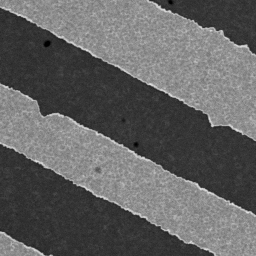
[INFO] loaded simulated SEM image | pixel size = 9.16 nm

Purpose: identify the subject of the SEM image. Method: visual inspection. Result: one or a few lines or trenches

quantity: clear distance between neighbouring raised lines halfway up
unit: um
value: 0.619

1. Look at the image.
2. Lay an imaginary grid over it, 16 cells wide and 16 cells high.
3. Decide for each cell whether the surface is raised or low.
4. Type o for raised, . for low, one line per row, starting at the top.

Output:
oooooooooo......
..oooooooooo....
....oooooooooo..
......oooooooooo
........oooooooo
o.........oooooo
oo..........oooo
ooooo........ooo
oooooo.........o
.ooooooo........
...ooooooo......
.....ooooooo....
.......ooooooo..
.........ooooooo
...........ooooo
oo...........ooo